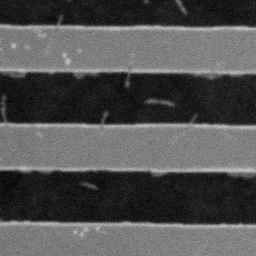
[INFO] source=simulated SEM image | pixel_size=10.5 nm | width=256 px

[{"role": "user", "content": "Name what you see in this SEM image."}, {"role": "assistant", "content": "lines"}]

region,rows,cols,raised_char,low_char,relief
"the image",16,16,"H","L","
LLLLLLLLLLLLLLLL
LLLLLLLLLLLLLLLL
HHHHHHHHHHHHHHHH
HHHHHHHHHHHHHHHH
LLLLLLLLHHHHHHHH
LLLLLLLLLLLLLLLL
LLLLLLLLLLLLLLLL
LLLLLLLLLLLLLLLL
HHHHHHHHHHHHHHHH
HHHHHHHHHHHHHHHH
HHHHHHHHHHHHHHHH
LLLLLLLLLLLLLLLL
LLLLLLLLLLLLLLLL
LLLLLLLLLLLLLLLL
HHHHHHHHHHHHHHHH
HHHHHHHHHHHHHHHH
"